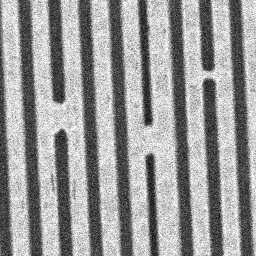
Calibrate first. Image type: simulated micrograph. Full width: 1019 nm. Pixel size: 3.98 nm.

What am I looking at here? parallel lines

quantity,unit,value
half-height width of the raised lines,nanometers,67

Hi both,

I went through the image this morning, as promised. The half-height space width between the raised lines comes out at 52.1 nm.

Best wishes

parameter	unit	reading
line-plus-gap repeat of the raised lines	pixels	30.1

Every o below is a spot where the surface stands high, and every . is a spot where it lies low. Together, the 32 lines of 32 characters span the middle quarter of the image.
oooo....oooo...oooo...ooooo...oo
oooo....oooo...oooo...ooooo...oo
oooo....oooo...oooo...ooooo...oo
oooo....oooo...oooo...ooooo....o
oooo....oooo...oooo...ooooo...oo
oooo....oooo...oooo...ooooo...oo
ooooo...oooo...oooo...ooooo...oo
ooooo...oooo....oooo..ooooo....o
ooooo...oooo....oooo..ooooo....o
ooooo...oooo....oooo..ooooo....o
oooo....oooo....oooo..ooooo....o
ooooo...oooo....oooo..ooooo....o
ooooo...oooo....oooo..ooooo....o
ooooo...oooo....oooo..ooooo....o
ooooo...oooo....oooo..ooooo....o
ooooo...oooo....ooooooooooo....o
ooooo...oooo....ooooooooooo....o
.oooo....oooo...ooooooooooo....o
.oooo....oooo...oooooooooooo...o
.oooo....oooo...oooooooooooo...o
.oooo....oooo...oooooooooooo...o
.oooo....oooo...oooooooooooo...o
.oooo....oooo...ooooo.oooooo...o
.oooo....oooo...oooo...ooooo...o
.oooo....oooo...oooo...ooooo...o
.oooo....oooo...oooo...ooooo...o
.oooo....oooo...oooo...ooooo...o
.ooooo...oooo...oooo...ooooo...o
.ooooo...oooo....oooo..ooooo....
.ooooo...oooo....oooo..ooooo....
.ooooo...oooo....oooo..ooooo....
.ooooo...oooo....oooo..ooooo....